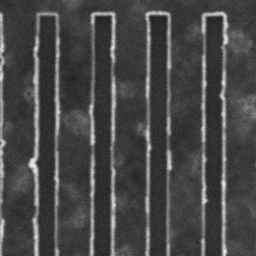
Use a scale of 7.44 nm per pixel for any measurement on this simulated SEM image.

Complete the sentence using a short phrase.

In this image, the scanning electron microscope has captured parallel lines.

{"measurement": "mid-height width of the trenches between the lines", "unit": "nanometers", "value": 135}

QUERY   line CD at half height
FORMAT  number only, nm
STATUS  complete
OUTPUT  277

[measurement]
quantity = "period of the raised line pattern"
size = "414 nm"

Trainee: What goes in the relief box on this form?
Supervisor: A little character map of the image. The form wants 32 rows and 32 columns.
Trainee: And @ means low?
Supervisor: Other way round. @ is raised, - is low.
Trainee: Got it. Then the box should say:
@@@@@@@@@@@@@@@@@@@@@@@@@@@@@@@@
@@@@@@@@@@@@@@@@@@@@@@@@@@@@@@@@
@@@@@--@@@@@--@@@@@--@@@@@--@@@@
@@@@@--@@@@@--@@@@@--@@@@@--@@@@
@@@@@--@@@@@--@@@@@--@@@@@--@@@@
@@@@@--@@@@@--@@@@@--@@@@@--@@@@
@@@@@--@@@@@--@@@@@--@@@@@--@@@@
@@@@@--@@@@@--@@@@@--@@@@@--@@@@
@@@@@--@@@@@--@@@@@--@@@@@--@@@@
@@@@@--@@@@@--@@@@@--@@@@@--@@@@
@@@@@--@@@@@--@@@@@--@@@@@--@@@@
@@@@@--@@@@@--@@@@@--@@@@---@@@@
@@@@@--@@@@@--@@@@@--@@@@---@@@@
@@@@@--@@@@@--@@@@@--@@@@---@@@@
@@@@@--@@@@@--@@@@@--@@@@@--@@@@
@@@@@--@@@@@--@@@@@--@@@@@--@@@@
@@@@@--@@@@@--@@@@@--@@@@@--@@@@
@@@@@--@@@@@--@@@@@--@@@@@--@@@@
@@@@@--@@@@@--@@@@@--@@@@---@@@@
@@@@@--@@@@@--@@@@@--@@@@@--@@@@
@@@@---@@@@@--@@@@@--@@@@@--@@@@
@@@@@--@@@@@--@@@@@--@@@@---@@@@
@@@@@--@@@@@--@@@@@--@@@@@--@@@@
@@@@@--@@@@@--@@@@@--@@@@@--@@@@
@@@@@--@@@@@--@@@@@--@@@@@--@@@@
@@@@@--@@@@@--@@@@@--@@@@@--@@@@
@@@@@--@@@@@--@@@@@--@@@@---@@@@
@@@@---@@@@@--@@@@@--@@@@---@@@@
@@@@@--@@@@@--@@@@@--@@@@---@@@@
@@@@@--@@@@@--@@@@@--@@@@---@@@@
@@@@@--@@@@@--@@@@@--@@@@---@@@@
@@@@@--@@@@@--@@@@@--@@@@---@@@@